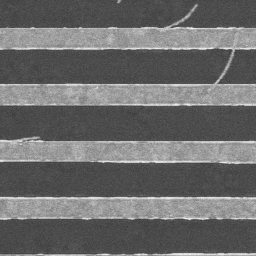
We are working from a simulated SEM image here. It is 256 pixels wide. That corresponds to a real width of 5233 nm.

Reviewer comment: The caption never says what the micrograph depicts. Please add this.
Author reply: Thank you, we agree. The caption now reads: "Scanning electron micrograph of lines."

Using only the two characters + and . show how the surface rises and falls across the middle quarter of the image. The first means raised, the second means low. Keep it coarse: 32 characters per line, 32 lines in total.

................................
................................
................................
................................
................................
++++++++++++++++++++++++++++++++
++++++++++++++++++++++++++++++++
++++++++++++++++++++++++++++++++
++++++++++++++++++++++++++++++++
++++++++++++++++++++++++++++++++
................................
................................
................................
................................
................................
................................
................................
................................
................................
................................
++++++++++++++++++++++++++++++++
++++++++++++++++++++++++++++++++
++++++++++++++++++++++++++++++++
++++++++++++++++++++++++++++++++
................................
................................
................................
................................
................................
................................
................................
................................